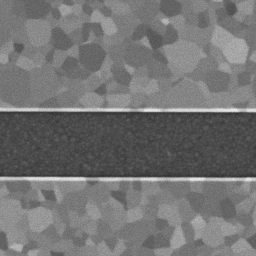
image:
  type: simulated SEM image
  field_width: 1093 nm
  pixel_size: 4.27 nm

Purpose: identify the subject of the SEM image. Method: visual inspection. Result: one or a few lines or trenches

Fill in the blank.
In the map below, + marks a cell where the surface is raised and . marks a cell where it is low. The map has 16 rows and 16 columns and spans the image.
++++++++++++++++
++++++++++++++++
++++++++++++++++
++++++++++++++++
++++++++++++++++
++++++++++++++++
++++++++++++++++
................
................
................
................
++++++++++++++++
++++++++++++++++
++++++++++++++++
++++++++++++++++
++++++++++++++++